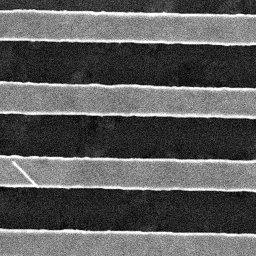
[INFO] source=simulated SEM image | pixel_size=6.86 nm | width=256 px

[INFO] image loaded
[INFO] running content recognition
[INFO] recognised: lines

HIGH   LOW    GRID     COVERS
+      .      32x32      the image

................................
+++++++++++++...................
++++++++++++++++++++++++++++++++
++++++++++++++++++++++++++++++++
++++++++++++++++++++++++++++++++
..........................++++++
................................
................................
................................
................................
++++++..........................
++++++++++++++++++++++++++++++++
++++++++++++++++++++++++++++++++
++++++++++++++++++++++++++++++++
.....................+++++++++++
................................
................................
................................
................................
+++.............................
++++++++++++++++++++++++++++++++
++++++++++++++++++++++++++++++++
++++++++++++++++++++++++++++++++
........+....+++++++++++++++++++
................................
................................
................................
................................
................................
++++++++++++++++++++++++++++++++
++++++++++++++++++++++++++++++++
++++++++++++++++++++++++++++++++